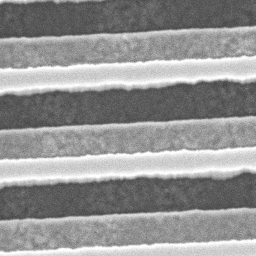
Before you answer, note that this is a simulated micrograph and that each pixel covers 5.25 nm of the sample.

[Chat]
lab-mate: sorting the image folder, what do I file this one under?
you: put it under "lines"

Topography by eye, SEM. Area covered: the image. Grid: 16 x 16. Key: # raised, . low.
................
................
################
################
################
#####...........
................
............####
################
################
################
................
................
......##########
################
################